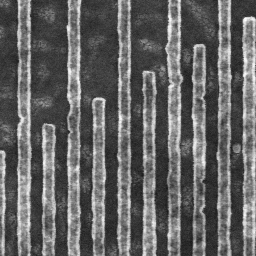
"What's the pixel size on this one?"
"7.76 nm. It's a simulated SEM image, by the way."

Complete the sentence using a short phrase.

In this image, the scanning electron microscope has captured parallel lines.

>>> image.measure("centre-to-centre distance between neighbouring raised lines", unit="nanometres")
194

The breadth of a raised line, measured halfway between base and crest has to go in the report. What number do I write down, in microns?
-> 0.0776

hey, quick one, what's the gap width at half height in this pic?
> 116 nanometres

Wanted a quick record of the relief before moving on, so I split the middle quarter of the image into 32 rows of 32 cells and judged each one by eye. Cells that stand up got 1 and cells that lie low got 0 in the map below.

01110000000000110000000000111000
01110000000000110000000000111000
01110000000000110000110000011000
01100000000000110000110000011000
01110000000000110000110000011000
01110000000000110000111000011000
01110000000000110000111000011000
01110000000000110000111000011000
01110000000000110000110000111000
00110001110000110000110000111000
00110001110000110000110000111000
00110000110000110000110000111000
00110000110000110000110000111000
01110000110000110000111000011000
01110000110000110000111000011000
01110000110000110000110000111000
01110000110000110000110000011000
01110000110000110000110000111000
01110000110000110000110000111000
01110000110000110000110000110000
01110000110000110000110000110000
01110000110000110000110000011000
01110000110000110000110000011000
01110000110000110000111000111000
01110000110000110000111000111000
01110000110000110000111000011000
01100000110000110000110000011000
01110001110000110000110000111000
01110000110000110000111000111000
01110000110000110000111000111000
01110000110000110000110000111000
01110001110000110000110000111000